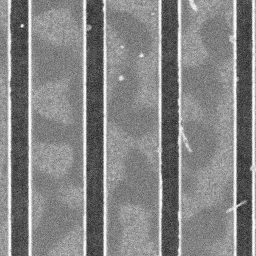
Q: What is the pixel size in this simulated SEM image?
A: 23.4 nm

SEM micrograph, lines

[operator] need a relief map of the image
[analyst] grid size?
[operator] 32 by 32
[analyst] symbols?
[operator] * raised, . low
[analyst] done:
*...*******..*******..*******...
*...*******..*******..*******...
*...*******..*******..*******...
*...*******..*******..*******...
*...*******..*******..*******...
*...*******..*******..*******...
*...*******..*******..*******...
*...*******..*******..*******...
*...*******..*******..*******...
*...*******..*******..*******...
*...*******..*******..*******...
*...*******..*******..*******...
*...*******..*******..*******...
*...*******..*******..*******...
*...*******..*******..*******...
*...*******..*******..*******...
*...*******..*******..*******...
*...*******..*******..*******...
*...*******..*******..*******...
*...*******..*******..*******...
*...*******..*******..*******...
*...*******..*******..*******...
*...*******..*******..*******...
*...*******..*******..*******...
*...*******..*******..*******...
*...*******..*******..********..
*...*******..*******..*******...
*...*******..*******..*******...
*...*******..*******..*******...
*...*******..*******..*******...
*...*******..*******..*******...
*...*******..*******..*******...